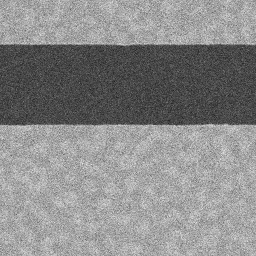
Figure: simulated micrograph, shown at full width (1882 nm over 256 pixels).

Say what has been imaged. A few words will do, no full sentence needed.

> one or a few lines or trenches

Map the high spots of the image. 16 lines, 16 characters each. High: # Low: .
################
################
################
................
................
................
................
................
################
################
################
################
################
################
################
################